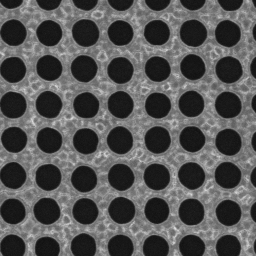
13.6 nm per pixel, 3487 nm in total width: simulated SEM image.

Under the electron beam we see a regular array of holes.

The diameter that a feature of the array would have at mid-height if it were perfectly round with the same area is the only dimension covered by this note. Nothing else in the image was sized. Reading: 0.362 µm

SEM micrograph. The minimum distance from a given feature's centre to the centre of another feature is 468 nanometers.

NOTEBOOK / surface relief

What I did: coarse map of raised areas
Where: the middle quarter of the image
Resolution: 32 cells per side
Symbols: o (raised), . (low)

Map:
oo......ooo......ooo.......oo...
oo......ooo......ooo.......oo...
oo......ooo......ooo.......oo...
ooo.....ooo......oooo.....ooooo.
ooooo.ooooooo...ooooooo.oooooooo
oooooooooooooooooooooooooooooooo
oooooooooooooooooooooooooooooooo
oooo...ooooo....oooooo...ooooo..
ooo.....ooo......oooo.....ooo...
oo.......oo......ooo.......oo...
oo.......oo......ooo.......oo...
ooo......oo......oooo......oo...
ooo.....oooo.....oooo.....oooo..
ooooo..oooooo...oooooo...ooooooo
oooooooooooooooooooooooooooooooo
ooooooooooooo..ooooooooooooooooo
oooo...ooooo....ooooo.....oooo..
ooo.....ooo......ooo......ooo...
oo.......oo......ooo.......oo...
oo.......o.......ooo.......oo...
oo......ooo......oooo.....ooo...
ooo.....oooo....ooooo.....oooo..
ooooo.oooooooo.ooooooooooooooooo
oooooooooooooooooooooooooooooooo
ooooooooooooooooooooooooooooooo.
oooo..oooooo....ooooo....oooo...
ooo....oooo......ooo......ooo...
oo......ooo......ooo......oo....
oo......ooo.......oo.......oo...
oo......ooo.......oo......ooo...
oo......oooo.....oooo.....oooo..
ooo....ooooooo..oooooo...oooooo.